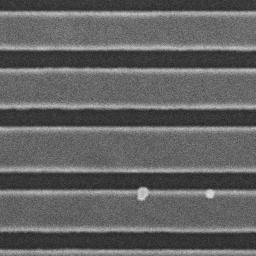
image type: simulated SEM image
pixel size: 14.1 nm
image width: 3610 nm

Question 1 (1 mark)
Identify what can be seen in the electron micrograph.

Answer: lines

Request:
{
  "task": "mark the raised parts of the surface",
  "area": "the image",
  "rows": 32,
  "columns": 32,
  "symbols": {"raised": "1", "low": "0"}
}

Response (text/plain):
00000000000000000000000000000000
00110000000000000000000111100000
11111111111111111111111111111111
11111111111111111111111111111111
11111111111111111111111111111111
11111111111111111111111111111111
00000000000000000000000000000000
00000000000000000000000000000000
00000000000000000000000000000000
11111111111111111111111111111111
11111111111111111111111111111111
11111111111111111111111111111111
11111111111111111111111111111111
11110001111111111111111111111111
00000000000000000000000000000000
00000000000000000000000000000000
11111111111111111111111111111111
11111111111111111111111111111111
11111111111111111111111111111111
11111111111111111111111111111111
11111111111111111111111111111111
00000000000000011011111000000100
00000000000000000000000000000000
00000000000000000000000000000000
11111111111111111111111111111111
11111111111111111111111111111111
11111111111111111111111111111111
11111111111111111111111111111111
11111111111111111111111111111111
00000000000000000000000000000000
00000000000000000000000000000000
11111111111111111111111111111111